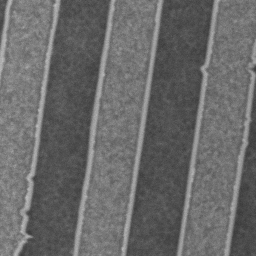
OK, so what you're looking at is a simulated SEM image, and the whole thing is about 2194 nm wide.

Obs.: one or a few lines or trenches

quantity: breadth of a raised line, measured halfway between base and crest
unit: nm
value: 419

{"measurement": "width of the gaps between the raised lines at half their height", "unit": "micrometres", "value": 0.462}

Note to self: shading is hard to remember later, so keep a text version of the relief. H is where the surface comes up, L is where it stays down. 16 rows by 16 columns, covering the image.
HHHHLLLHHHLLLHHH
HHHLLLLHHHLLLHHH
HHHLLLLHHHLLLHHH
HHHLLLHHHHLLLHHH
HHHLLLHHHLLLLHHH
HHHLLLHHHLLLLHHH
HHHLLLHHHLLLLHHH
HHHLLLHHHLLLHHHH
HHLLLLHHHLLLHHHL
HHLLLLHHHLLLHHHL
HHLLLLHHHLLLHHHL
HHLLLHHHLLLLHHHL
HHLLLHHHLLLLHHHL
HHLLLHHHLLLLHHHL
HHLLLHHHLLLHHHLL
HLLLLHHHLLLHHHLL